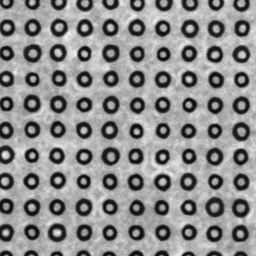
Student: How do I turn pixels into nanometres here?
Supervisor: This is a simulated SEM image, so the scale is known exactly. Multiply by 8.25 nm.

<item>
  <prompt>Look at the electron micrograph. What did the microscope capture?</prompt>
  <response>a regular array of ring-shaped grooves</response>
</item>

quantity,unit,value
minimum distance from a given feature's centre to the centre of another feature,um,0.207